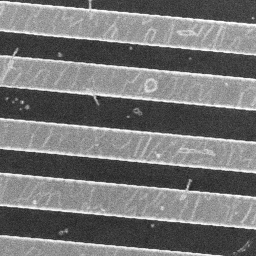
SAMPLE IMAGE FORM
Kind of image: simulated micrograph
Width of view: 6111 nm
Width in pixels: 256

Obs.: lines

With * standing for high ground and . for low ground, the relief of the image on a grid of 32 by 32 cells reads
****............................
***************.................
*************************.......
********************************
.......*************************
.................***************
............................****
*****...........................
****************................
****************************....
********************************
........************************
...................*************
.............................***
................................
*******.........................
******************..............
****************************....
********************************
..........**********************
.....................***********
................................
*********.......................
********************............
******************************..
********************************
.........***********************
....................************
..............................**
................................
***********.....................
***********************.........